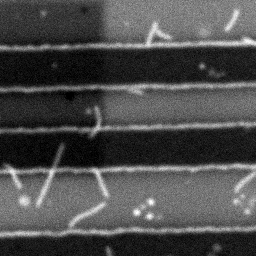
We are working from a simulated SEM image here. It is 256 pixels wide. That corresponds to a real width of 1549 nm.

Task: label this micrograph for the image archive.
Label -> lines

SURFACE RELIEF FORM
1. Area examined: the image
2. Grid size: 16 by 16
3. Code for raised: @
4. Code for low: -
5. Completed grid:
----------------
----------------
----------------
@@@@@@@@@@@@@@@@
@@@@@@@@@@@@@@@@
@@@@@@----------
----------------
----------------
@@@@@@@@@@@@@@@@
@@@@@@@@@@@@@@@@
@@@@@@@@@@@@@---
----------------
----------------
----------------
----@@@@@@@@@@@@
@@@@@@@@@@@@@@@@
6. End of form